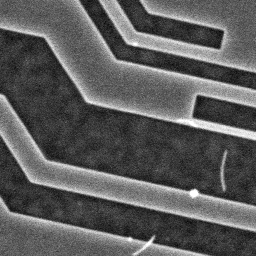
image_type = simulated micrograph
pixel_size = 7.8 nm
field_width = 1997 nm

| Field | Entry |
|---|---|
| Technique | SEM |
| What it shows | groups of lines, slits or small figures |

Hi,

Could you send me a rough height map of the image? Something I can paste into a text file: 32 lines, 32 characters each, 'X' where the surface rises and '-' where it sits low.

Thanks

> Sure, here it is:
XXXXXXXXXX---XX---XXXXXXXXXXXXXX
XXXXXXXXXXX--XX----XXXXXXXXXXXXX
XXXXXXXXXXX---XX-------XXXXXXXXX
XXXXXXXXXXXX---XX----------XXXXX
-----XXXXXXXX--XXXX---------XXXX
------XXXXXXX---XXXXXXXX----XXXX
-------XXXXXXX-------XXXXXXXXXXX
-------XXXXXXXX----------XXXXXXX
--------XXXXXXXXXXX-----------XX
---------XXXXXXXXXXXXXXX--------
---------XXXXXXXXXXXXXXXXXXX----
----------XXXXXXXXXXXXXXXXXXXXXX
X----------XXXXXXXXXXXXX----XXXX
X-------------XXXXXXXXXX--------
XX----------------XXXXXX--------
XXX--------------------XXXX-----
XXX------------------------XXXXX
XXXX----------------------------
-XXXX---------------------------
--XXX---------------------------
--XXXXXX------------------------
---XXXXXXXXX--------------------
----XXXXXXXXXXXXX---------------
-------XXXXXXXXXXXXXXX----------
------------XXXXXXXXXXXXXX------
X---------------XXXXXXXXXXXXXX--
XX-------------------XXXXXXXXXXX
XXXXXX-------------------XXXXXXX
XXXXXXXXXX--------------------XX
XXXXXXXXXXXXXXX-----------------
XXXXXXXXXXXXXXXXXXX-------------
XXXXXXXXXXXXXXXXXXXXXXXX--------